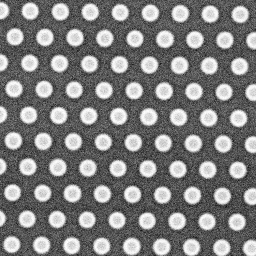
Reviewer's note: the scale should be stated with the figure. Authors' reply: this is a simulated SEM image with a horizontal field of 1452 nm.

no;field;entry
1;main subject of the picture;an array of small figures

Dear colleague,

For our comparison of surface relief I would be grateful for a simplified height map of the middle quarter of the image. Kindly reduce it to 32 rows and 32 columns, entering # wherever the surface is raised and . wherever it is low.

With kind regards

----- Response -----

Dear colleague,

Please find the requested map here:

#...####....####...####....####.
.....###....###.....###....####.
................................
................................
................................
.###....####....###....####....#
.###....####....###....####....#
.###....####....###....####....#
.........##......#......##.....#
................................
................................
.....##.....###.....##......#...
#...####....####...####....####.
#...####....####...####....####.
.....##.....###....####....###..
................................
................................
..#.............................
####....####....###....###.....#
####....####...####....####...##
.###....####...####....####...##
................##......##.....#
................................
................................
.....##.....###.....##......#...
....####....###....####....###..
....####....###....####....###..
.....##.....###....####....###..
................................
................................
.##.............................
####....###....####....###.....#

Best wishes